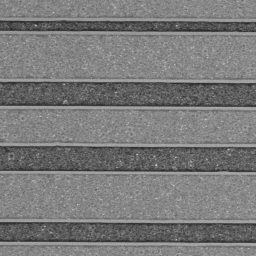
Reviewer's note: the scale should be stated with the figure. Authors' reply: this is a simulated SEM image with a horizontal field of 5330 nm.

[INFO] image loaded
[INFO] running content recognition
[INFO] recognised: one or a few lines or trenches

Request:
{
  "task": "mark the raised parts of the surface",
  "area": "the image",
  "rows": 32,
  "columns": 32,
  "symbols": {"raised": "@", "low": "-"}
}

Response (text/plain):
@@@@@@@@@@@@@@@@@@@@@@@@@@@@@@@@
@@@@@@@@@@@@@@@@@@@@@@@@@@@@@@@@
--------------------------------
--------------------------------
@@@@@@@@@@@@@@@@@@@@@@@@@@@@@@@@
@@@@@@@@@@@@@@@@@@@@@@@@@@@@@@@@
@@@@@@@@@@@@@@@@@@@@@@@@@@@@@@@@
@@@@@@@@@@@@@@@@@@@@@@@@@@@@@@@@
@@@@@@@@@@@@@@@@@@@@@@@@@@@@@@@@
@@@@@@@@@@@@@@@@@@@@@@@@@@@@@@@@
--------------------------------
--------------------------------
--------------------------------
@@------------------------------
@@@@@@@@@@@@@@@@@@@@@@@@@@@@@@@@
@@@@@@@@@@@@@@@@@@@@@@@@@@@@@@@@
@@@@@@@@@@@@@@@@@@@@@@@@@@@@@@@@
@@@@@@@@@@@@@@@@@@@@@@@@@@@@@@@@
--------------------------------
--------------------------------
--------------------------------
--------------------------------
@@@@@@@@@@@@@@@@@@@@@@@@@@@@@@@@
@@@@@@@@@@@@@@@@@@@@@@@@@@@@@@@@
@@@@@@@@@@@@@@@@@@@@@@@@@@@@@@@@
@@@@@@@@@@@@@@@@@@@@@@@@@@@@@@@@
@@@@@@@@@@@@@@@@@@@@@@@@@@@@@@@@
-@@@@@@@@@@@@@@@@@@@@@@@@@@@@@@@
--------------------------------
--------------------------------
@@@-----------------------------
@@@@@@@@@@@@@@@@@@@@@@@@@@@@@@@@